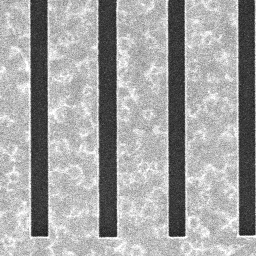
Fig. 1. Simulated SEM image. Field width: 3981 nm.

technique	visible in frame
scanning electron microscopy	one or a few lines or trenches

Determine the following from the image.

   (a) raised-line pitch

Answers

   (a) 1080 nanometres